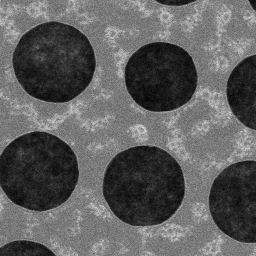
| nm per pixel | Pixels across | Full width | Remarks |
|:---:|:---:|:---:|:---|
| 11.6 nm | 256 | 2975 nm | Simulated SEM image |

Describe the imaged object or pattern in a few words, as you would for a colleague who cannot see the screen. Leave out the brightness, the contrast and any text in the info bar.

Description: holes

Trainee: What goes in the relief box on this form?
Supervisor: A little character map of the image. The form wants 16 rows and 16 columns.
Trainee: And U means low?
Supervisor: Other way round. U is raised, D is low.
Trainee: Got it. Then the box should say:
UUUUUUUUUUUUUUUU
UUUDUUUUUUUUUUUU
UDDDDDUUUUUUUUUU
UDDDDDUUDDDDUUUU
UDDDDDUUDDDDUUDD
UDDDDUUUDDDDUUDD
UUUUUUUUUDDDUUDD
UUUUUUUUUUUUUUUD
UDDUUUUUUUUUUUUU
DDDDDUUUDDUUUUUU
DDDDDUUDDDDUUUDD
DDDDDUDDDDDDUDDD
UDDDUUUDDDDUUDDD
UUUUUUUDDDDUUDDD
UUUUUUUUUUUUUUDD
DDDUUUUUUUUUUUUU